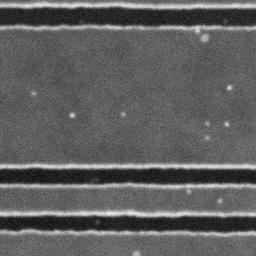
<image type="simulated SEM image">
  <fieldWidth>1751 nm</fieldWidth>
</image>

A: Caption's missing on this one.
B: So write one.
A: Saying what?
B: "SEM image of lines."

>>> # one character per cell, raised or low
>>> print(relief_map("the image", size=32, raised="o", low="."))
oooooooooooooooooooooooooooooooo
................................
................................
oooooooooooooooooooooooooooooooo
oooooooooooooooooooooooooooooooo
oooooooooooooooooooooooooooooooo
oooooooooooooooooooooooooooooooo
oooooooooooooooooooooooooooooooo
oooooooooooooooooooooooooooooooo
oooooooooooooooooooooooooooooooo
oooooooooooooooooooooooooooooooo
oooooooooooooooooooooooooooooooo
oooooooooooooooooooooooooooooooo
oooooooooooooooooooooooooooooooo
oooooooooooooooooooooooooooooooo
oooooooooooooooooooooooooooooooo
oooooooooooooooooooooooooooooooo
oooooooooooooooooooooooooooooooo
oooooooooooooooooooooooooooooooo
oooooooooooooooooooooooooooooooo
oooooooooooooooooooooooooooooooo
................................
................................
oooooooooooooooooooooooooooooooo
oooooooooooooooooooooooooooooooo
oooooooooooooooooooooooooooooooo
oooooooooooooooooooooooooooooooo
................................
................................
oooooooooooooooooooooooooooooooo
oooooooooooooooooooooooooooooooo
oooooooooooooooooooooooooooooooo